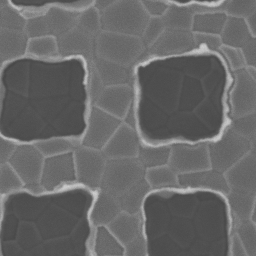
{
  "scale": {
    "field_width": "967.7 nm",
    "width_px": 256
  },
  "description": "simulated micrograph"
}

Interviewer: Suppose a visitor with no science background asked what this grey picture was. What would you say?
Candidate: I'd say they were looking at holes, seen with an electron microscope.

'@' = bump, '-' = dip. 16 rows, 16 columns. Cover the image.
@@@@@@@@@@@@@@@@
@@@@@@@@@@@@@@@@
@@@@@@@@@@@@@@@@
@@@@@@@@@@@-@@@@
-----@@@@-----@@
-----@@@@-----@@
-----@@@@-----@@
-----@@@@-----@@
----@@@@@----@@@
@@@@@@@@@@@@@@@@
@@@@@@@@@@@@@@@@
@@@@@@@@@@@@@@@@
------@@@-----@@
-----@@@@-----@@
------@@@-----@@
-----@@@@-----@@